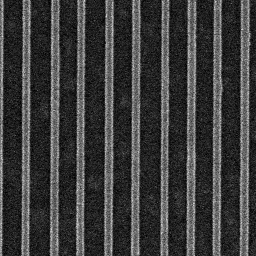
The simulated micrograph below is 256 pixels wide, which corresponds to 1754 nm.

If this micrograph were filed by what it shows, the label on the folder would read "parallel lines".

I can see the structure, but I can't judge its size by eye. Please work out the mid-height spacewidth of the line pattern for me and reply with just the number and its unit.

141 nanometers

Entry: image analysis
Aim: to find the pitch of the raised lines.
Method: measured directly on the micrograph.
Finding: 187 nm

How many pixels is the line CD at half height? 6.38